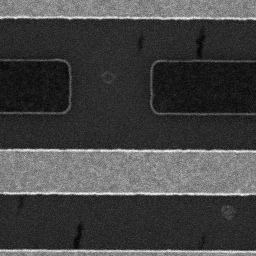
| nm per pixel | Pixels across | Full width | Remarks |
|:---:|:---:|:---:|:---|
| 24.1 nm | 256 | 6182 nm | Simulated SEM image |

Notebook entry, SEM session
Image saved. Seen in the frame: one or a few lines or trenches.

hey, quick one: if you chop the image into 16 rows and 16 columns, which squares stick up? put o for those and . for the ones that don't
oooooooooooooooo
................
................
................
oooo......oooooo
oooo.....ooooooo
oooo......oooooo
................
................
oooooooooooooooo
oooooooooooooooo
oooooooooooooooo
................
................
................
................